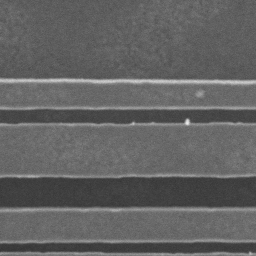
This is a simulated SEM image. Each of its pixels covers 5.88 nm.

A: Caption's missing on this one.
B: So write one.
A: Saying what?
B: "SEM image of lines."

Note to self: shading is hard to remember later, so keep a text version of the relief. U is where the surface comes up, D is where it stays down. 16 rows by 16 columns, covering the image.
DDDDDDDDDDDDDDDD
DDDDDDDDDDDDDDDD
DDDDDDDDDDDDDDDD
DDDDDDDDDDDDDDDD
DDDDDDDDDDDDDDDD
UUUUUUUUUUUUUUUU
UUUUUUUUUUUUUUUU
UUUUUUUUUUUUUUUU
UUUUUUUUUUUUUUUU
UUUUUUUUUUUUUUUU
UUUUUUUUUUUUUUUU
DDDDDDDDDDDDDDDD
DDDDDDDDDDDDDDDD
UUUUUUUUUUUUUUUU
UUUUUUUUUUUUUUUU
UUUUUUUUUUUUUUUU